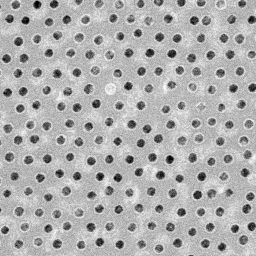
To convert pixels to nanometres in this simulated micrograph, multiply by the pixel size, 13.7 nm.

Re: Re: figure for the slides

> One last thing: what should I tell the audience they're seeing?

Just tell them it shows a regular array of holes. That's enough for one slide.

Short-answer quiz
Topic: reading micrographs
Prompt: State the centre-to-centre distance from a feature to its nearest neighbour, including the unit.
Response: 17.2 px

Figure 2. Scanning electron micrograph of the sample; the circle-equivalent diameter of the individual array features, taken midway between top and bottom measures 131 nm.